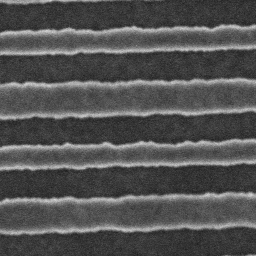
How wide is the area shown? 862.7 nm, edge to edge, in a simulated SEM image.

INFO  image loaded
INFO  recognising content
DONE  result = lines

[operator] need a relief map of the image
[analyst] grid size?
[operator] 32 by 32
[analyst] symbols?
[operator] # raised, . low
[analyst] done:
................................
................................
................................
................#.....####.#####
################################
################################
############.###.#..............
................................
................................
................................
.#.##..#########################
################################
################################
################################
####..##..#.....................
................................
................................
.............................#..
################################
################################
##############################..
................................
................................
................................
.....................###.#######
################################
################################
################################
####################....#.......
................................
................................
................................